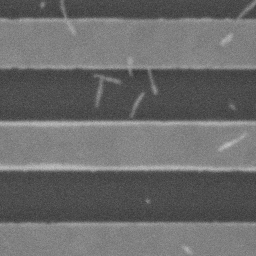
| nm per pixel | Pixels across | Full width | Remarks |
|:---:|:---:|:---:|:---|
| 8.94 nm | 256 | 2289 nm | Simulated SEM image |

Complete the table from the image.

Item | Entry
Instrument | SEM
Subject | lines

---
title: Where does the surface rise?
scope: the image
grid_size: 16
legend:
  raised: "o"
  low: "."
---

................
oooooooooooooooo
oooooooooooooooo
oooooooooooooooo
................
................
................
................
oooooooooooooooo
oooooooooooooooo
oo..oooooooooooo
................
................
................
oooooooooooooooo
oooooooooooooooo